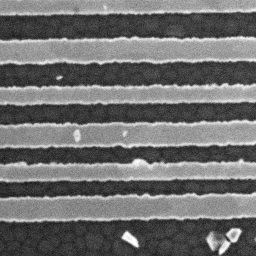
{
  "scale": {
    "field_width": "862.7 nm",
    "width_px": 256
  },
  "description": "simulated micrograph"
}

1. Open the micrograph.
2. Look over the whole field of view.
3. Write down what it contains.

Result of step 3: lines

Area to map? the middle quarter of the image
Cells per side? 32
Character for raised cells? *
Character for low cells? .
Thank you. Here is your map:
................................
................................
................................
................................
................................
....*.***...**....**.***********
********************************
********************************
********************************
***************.*********.***..*
................................
................................
................................
................................
................................
********************************
********************************
********************************
********************************
********************************
*******..***...****...*.........
................................
................................
................................
.................****...*.....*.
********************************
********************************
********************************
********************************
................................
................................
................................